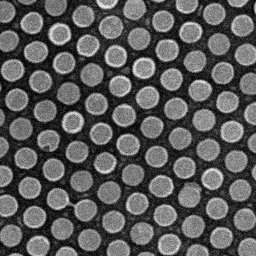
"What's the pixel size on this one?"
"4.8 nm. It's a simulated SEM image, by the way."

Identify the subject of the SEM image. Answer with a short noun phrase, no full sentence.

a regular array of raised bodies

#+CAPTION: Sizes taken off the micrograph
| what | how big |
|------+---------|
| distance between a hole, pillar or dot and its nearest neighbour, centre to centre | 142 nanometres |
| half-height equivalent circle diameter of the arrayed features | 103 nm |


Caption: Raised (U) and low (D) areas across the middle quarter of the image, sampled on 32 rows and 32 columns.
UUUDDDUUUDDDUUDDDUUUUUUDDDDDDDUU
UUDDDUUUUDDDDDDDDUUUUUUDDDUUDDDU
DDDDUUUUUUDDDDDDDDUUUUDDDUUUUDDD
DDDDUUUUUUDDUUUUDDDUUDDDUUUUUUDD
DDDDDUUUUDDDUUUUUDDDDDDDUUUUUDDD
UUUDDDDDDDDUUUUUUDDDDDDDDUUUUDDD
UUUUDDDDDDDDUUUUUDDUUUUDDDUDDDDU
UUUUDDDDUDDDUUUUDDDUUUUDDDDDDDDU
UUUUDDUUUUDDDDDDDDUUUUUUDDDDDDDD
UUUDDUUUUUUDDDDDDDDUUUUDDDUUUUDD
DDDDDDUUUUUDDDUUDDDUUUUDDUUUUUUD
DDDDDDUUUUDDDUUUUDDDDDDDDUUUUUUD
DUUUDDDDUDDDUUUUUUDDDDDDDUUUUUDD
UUUUUDDDDDDDUUUUUUDDDUUDDDUUUDDD
UUUUUDDDDDDDDUUUUDDDUUUUDDDDDDDD
UUUUUDDDUUUDDDDDDDDUUUUUUDDDDDDD
UUUUDDDUUUUUDDDDDDDUUUUUDDDUUUUD
DDDDDDDUUUUUDDDDDDDDUUUUDDDUUUUU
DDDDDDDUUUUUDDUUUUDDDDDDDDUUUUUU
DDDUDDDDUUUDDUUUUUUDDDDDDDDUUUUU
DUUUUUDDDDDDDUUUUUUDDDDDDDDUUUUD
DUUUUUDDDDDDDDUUUUUDDUUUUDDDDDDD
DUUUUUDDDUUDDDDUUUDDDUUUUUDDDDDD
DUUUUDDDUUUUUDDDDDDDDUUUUUDDDUUD
DDDDDDDDUUUUUDDDDDDDDUUUUDDDUUUU
DDDDDDDDUUUUUDDDUUUDDDUUDDDDUUUU
DDDDDDDDUUUUDDDUUUUUDDDDDDDDUUUU
DDDUUUDDDDDDDDDUUUUUDDDDDDDDUUUU
DDUUUUUDDDDDDDDUUUUUDDDUUUDDDUUD
DDUUUUUDDDDUDDDUUUUDDDUUUUUDDDDD
DDUUUUUDDUUUUUDDDDDDDUUUUUUDDDDD
DDDUUUDDDUUUUUDDDDDDDDUUUUUDDDUU